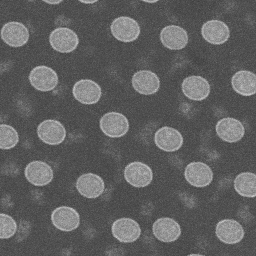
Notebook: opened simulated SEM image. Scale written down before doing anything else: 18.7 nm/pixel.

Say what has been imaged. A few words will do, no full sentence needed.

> a regular array of raised bodies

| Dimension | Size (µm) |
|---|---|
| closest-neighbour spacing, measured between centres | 0.809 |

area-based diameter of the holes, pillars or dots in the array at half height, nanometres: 477